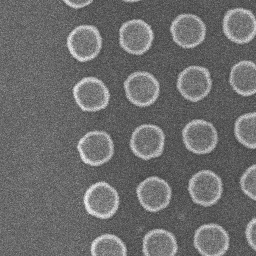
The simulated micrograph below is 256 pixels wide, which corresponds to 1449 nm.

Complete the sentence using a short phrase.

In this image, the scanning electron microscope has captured a regular array of raised bodies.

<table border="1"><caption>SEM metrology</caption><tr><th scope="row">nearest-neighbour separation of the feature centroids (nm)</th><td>294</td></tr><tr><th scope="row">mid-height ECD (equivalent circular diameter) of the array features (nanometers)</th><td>185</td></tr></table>